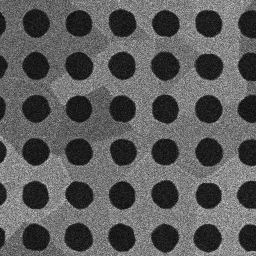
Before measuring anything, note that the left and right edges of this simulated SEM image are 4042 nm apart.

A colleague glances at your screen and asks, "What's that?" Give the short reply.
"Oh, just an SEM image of a regular array of holes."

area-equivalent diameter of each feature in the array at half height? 436 nanometers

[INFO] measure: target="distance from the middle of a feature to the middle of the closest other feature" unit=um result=0.674